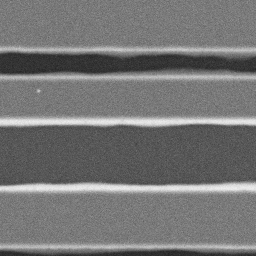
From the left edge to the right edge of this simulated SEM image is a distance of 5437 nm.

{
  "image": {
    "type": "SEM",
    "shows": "lines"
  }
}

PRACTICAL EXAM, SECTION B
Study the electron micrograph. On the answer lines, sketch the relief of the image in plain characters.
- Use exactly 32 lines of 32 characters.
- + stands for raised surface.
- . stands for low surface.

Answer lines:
++++++++++++++++++++++++++++++++
++++++++++++++++++++++++++++++++
++++++++++++++++++++++++++++++++
++++++++++++++++++++++++++++++++
++++++++++++++++++++++++++++++++
++++++++++++++++++++++++++++++++
............................+++.
................................
................................
....................++++++.++...
++++++++++++++++++++++++++++++++
++++++++++++++++++++++++++++++++
++++++++++++++++++++++++++++++++
++++++++++++++++++++++++++++++++
++++++++++++++++++++++++++++++++
................................
................................
................................
................................
................................
................................
................................
................................
................................
++++++++++++++++++++++++++++++++
++++++++++++++++++++++++++++++++
++++++++++++++++++++++++++++++++
++++++++++++++++++++++++++++++++
++++++++++++++++++++++++++++++++
++++++++++++++++++++++++++++++++
++++++++++++++++++++++++++++++++
................................